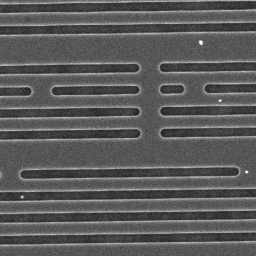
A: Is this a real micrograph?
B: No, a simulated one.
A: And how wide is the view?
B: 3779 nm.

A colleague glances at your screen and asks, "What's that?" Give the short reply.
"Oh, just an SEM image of groups of lines, slits or small figures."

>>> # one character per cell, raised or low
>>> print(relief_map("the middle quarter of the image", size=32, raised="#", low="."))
...................#####........
...................#####........
.###############################
################################
################################
##................######......##
...................#####......##
..................#######....###
################################
################################
################################
...................#####........
...................#####........
################################
################################
################################
...................#####........
...................#####........
..................#######.....##
################################
################################
################################
################################
################################
################################
################################
................................
................................
......................##########
################################
################################
############....................